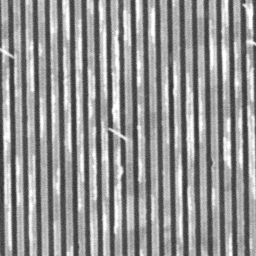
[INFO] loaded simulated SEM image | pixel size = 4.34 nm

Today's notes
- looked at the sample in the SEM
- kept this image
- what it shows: parallel lines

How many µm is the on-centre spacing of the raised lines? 0.053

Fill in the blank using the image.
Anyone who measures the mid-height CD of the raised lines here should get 26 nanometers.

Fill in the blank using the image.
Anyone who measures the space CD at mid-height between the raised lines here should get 26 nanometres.